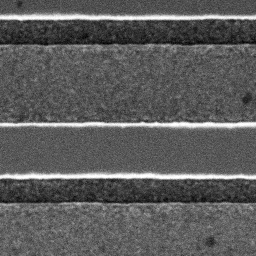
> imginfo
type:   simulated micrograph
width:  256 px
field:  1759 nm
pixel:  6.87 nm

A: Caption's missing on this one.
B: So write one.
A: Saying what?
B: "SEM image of lines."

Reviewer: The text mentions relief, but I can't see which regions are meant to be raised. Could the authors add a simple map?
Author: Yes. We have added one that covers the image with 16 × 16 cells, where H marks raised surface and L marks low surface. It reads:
HHHHHHHHHHHHHHHH
LLLLLLLLLLLLLLLL
LLLLLLLLLLLLLLLL
LLLLLLLLLLLLLLLL
LLLLLLLLLLLLLLLL
LLLLLLLLLLLLLLLL
LLLLLLLLLLLLLLLL
LLLLLLLLLLLLLLLL
HHHHHHHHHHHHHHHH
HHHHHHHHHHHHHHHH
HHHHHHHHHHHHHHHH
LLLLLLLLLLLLLLLL
LLLLLLLLLLLLLLLL
LLLLLLLLLLLLLLLL
LLLLLLLLLLLLLLLL
LLLLLLLLLLLLLLLL